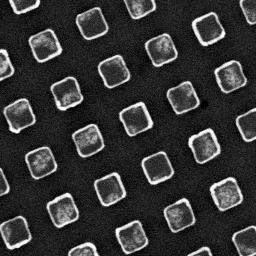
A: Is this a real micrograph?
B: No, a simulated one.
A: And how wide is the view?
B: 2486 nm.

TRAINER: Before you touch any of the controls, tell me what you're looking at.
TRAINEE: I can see a regular array of raised bodies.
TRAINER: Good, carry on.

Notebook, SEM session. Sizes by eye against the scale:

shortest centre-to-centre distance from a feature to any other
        502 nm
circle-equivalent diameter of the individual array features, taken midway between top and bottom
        287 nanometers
